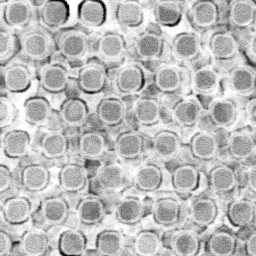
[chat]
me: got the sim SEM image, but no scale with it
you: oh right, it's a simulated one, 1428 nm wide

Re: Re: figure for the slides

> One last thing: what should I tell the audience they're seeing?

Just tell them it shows a regular array of raised bodies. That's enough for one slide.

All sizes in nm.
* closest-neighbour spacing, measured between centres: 207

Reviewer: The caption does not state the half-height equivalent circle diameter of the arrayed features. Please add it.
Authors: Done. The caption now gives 130 nm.